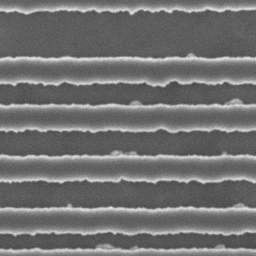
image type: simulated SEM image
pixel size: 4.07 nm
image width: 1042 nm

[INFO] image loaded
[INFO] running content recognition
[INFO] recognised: lines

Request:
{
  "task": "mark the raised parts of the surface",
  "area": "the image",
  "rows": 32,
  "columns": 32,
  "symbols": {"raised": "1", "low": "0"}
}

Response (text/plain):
11111111111111111111111111111111
00110000000000001000000100000000
00000000000000000000000000000000
00000000000000000000000000000000
00000000000000000000000000000000
00000000000000000000000000000000
00000000000000000000000000000000
11111111111111111111111111111111
11111111111111111111111111111111
11111111111111111111111111111111
01000111011000000001100000100100
00000000000000000000000000000000
00000000000000000000000000000000
11111111111111111111111111111111
11111111111111111111111111111111
11111111111111111111111111111111
00000000000000001000010000000000
00000000000000000000000000000000
00000000000000000000000000000000
10001100111101111111111110011111
11111111111111111111111111111111
11111111111111111111111111111111
11111111111111101111111111110001
00000000000000000000000000000000
00000000000000000000000000000000
00000000000000000000000000000000
11111111111111111111111111111111
11111111111111111111111111111111
11111111111111111111111111111111
00000000000000000000000000000000
00000000000000000000000000000000
11111111111111111111111111111111